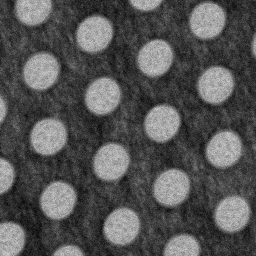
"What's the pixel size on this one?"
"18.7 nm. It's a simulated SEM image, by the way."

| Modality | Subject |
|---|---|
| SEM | a regular array of raised bodies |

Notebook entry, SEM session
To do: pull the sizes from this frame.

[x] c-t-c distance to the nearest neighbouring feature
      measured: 1210 nm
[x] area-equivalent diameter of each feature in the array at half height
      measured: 679 nanometres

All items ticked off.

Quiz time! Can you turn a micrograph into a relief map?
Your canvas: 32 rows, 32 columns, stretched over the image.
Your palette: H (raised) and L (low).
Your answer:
LLHHHHLLLLLLLLLLHHHHLLLLLHHLLLLL
LLHHHHLLLLLLLLLLLLLLLLLLHHHHLLLL
LLLHHHLLLLLHHLLLLLLLLLLLHHHHLLLL
LLLLLLLLLLHHHHLLLLLLLLLLHHHHLLLL
LLLLLLLLLLHHHHLLLLLLLLLLLHHLLLLL
LLLLLLLLLLHHHHLLLLHHHLLLLLLLLLLL
LLLLLLLLLLLLLLLLLHHHHHLLLLLLLLLL
LLLLHHHLLLLLLLLLLHHHHHLLLLLLLLLL
LLLHHHHLLLLLLLLLLLHHHLLLLLHHLLLL
LLLHHHHLLLLLLLLLLLLHLLLLLHHHHLLL
LLLHHHHLLLLHHHHLLLLLLLLLLHHHHLLL
LLLLLLLLLLLHHHHLLLLLLLLLLHHHHLLL
LLLLLLLLLLLHHHHLLLLLLLLLLLHHLLLL
HLLLLLLLLLLHHHLLLLLHHHLLLLLLLLLL
HLLLLLLLLLLLLLLLLLHHHHLLLLLLLLLL
LLLLLHHHLLLLLLLLLLHHHHLLLLLLLLLL
LLLLHHHHLLLLLLLLLLHHHHLLLLLLHLLL
LLLLHHHHLLLLLLLLLLLHHLLLLLHHHHLL
LLLLHHHHLLLLLHHLLLLLLLLLLLHHHHLL
LLLLLLLLLLLLHHHHLLLLLLLLLLHHHHLL
HLLLLLLLLLLLHHHHLLLLLLLLLLLHHLLL
HHLLLLLLLLLLHHHHLLLLLHHLLLLLLLLL
HHLLLLLLLLLLLHLLLLLLHHHHLLLLLLLL
HLLLLLHHHLLLLLLLLLLHHHHHLLLLLLLL
LLLLLHHHHLLLLLLLLLLHHHHLLLLLLLLL
LLLLLHHHHLLLLLLLLLLLHHLLLLLHHHHL
LLLLLLHHHLLLLLHHHLLLLLLLLLLHHHHL
LLLLLLLLLLLLLHHHHLLLLLLLLLLHHHHL
HHHLLLLLLLLLLHHHHLLLLLLLLLLLHHLL
HHHLLLLLLLLLLHHHHLLLLLHHLLLLLLLL
HHHLLLLLLLLLLLHHLLLLLHHHHLLLLLLL
HHLLLLLHHHLLLLLLLLLLLHHHHLLLLLLL